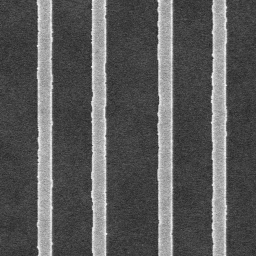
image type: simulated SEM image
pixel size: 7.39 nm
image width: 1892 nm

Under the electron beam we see lines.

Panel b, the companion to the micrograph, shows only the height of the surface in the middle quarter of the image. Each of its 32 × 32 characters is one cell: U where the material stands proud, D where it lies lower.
DDDDDDDUUUDDDDDDDDDDDDDDUUUDDDDD
DDDDDDDUUUDDDDDDDDDDDDDDUUUDDDDD
DDDDDDDUUUDDDDDDDDDDDDDDUUUDDDDD
DDDDDDDUUUDDDDDDDDDDDDDDUUUDDDDD
DDDDDDDUUUDDDDDDDDDDDDDDUUUDDDDD
DDDDDDDUUUDDDDDDDDDDDDDDUUUDDDDD
DDDDDDDUUUDDDDDDDDDDDDDDUUUDDDDD
DDDDDDDUUUDDDDDDDDDDDDDDUUUDDDDD
DDDDDDDUUUDDDDDDDDDDDDDDUUUDDDDD
DDDDDDDUUUDDDDDDDDDDDDDDUUUDDDDD
DDDDDDDUUUDDDDDDDDDDDDDDUUUDDDDD
DDDDDDDUUUDDDDDDDDDDDDDDUUUDDDDD
DDDDDDDUUUDDDDDDDDDDDDDDUUUDDDDD
DDDDDDDUUUDDDDDDDDDDDDDDUUUDDDDD
DDDDDDDUUUDDDDDDDDDDDDDDUUUDDDDD
DDDDDDDUUUDDDDDDDDDDDDDDUUUDDDDD
DDDDDDDUUUDDDDDDDDDDDDDDUUUDDDDD
DDDDDDDUUUDDDDDDDDDDDDDDUUUDDDDD
DDDDDDDUUUDDDDDDDDDDDDDDUUUDDDDD
DDDDDDDUUUDDDDDDDDDDDDDDUUUDDDDD
DDDDDDDUUUDDDDDDDDDDDDDDUUUDDDDD
DDDDDDDUUUDDDDDDDDDDDDDDUUUDDDDD
DDDDDDDUUUDDDDDDDDDDDDDDUUUDDDDD
DDDDDDDUUUDDDDDDDDDDDDDDUUUDDDDD
DDDDDDDUUUDDDDDDDDDDDDDDUUUDDDDD
DDDDDDDUUUDDDDDDDDDDDDDDUUUDDDDD
DDDDDDDUUUDDDDDDDDDDDDDDUUUDDDDD
DDDDDDDUUUDDDDDDDDDDDDDDUUUDDDDD
DDDDDDDUUUDDDDDDDDDDDDDDUUUDDDDD
DDDDDDDUUUDDDDDDDDDDDDDDUUUDDDDD
DDDDDDDUUUDDDDDDDDDDDDDDUUUDDDDD
DDDDDDDUUUDDDDDDDDDDDDDDUUUDDDDD